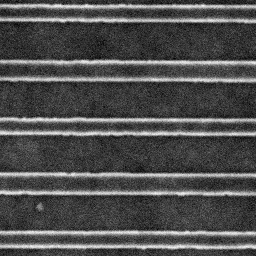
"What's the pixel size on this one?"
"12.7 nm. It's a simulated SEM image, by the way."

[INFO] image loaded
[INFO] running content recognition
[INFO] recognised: lines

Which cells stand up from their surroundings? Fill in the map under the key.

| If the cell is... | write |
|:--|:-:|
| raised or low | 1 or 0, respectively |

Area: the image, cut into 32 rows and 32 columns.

00000000000000000000000000000000
11111111111111111111111111111111
11111111111111111111111111111111
00000000000000000000000000000000
00000000000000000000000000000000
00000000000000000000000000000000
00000000000000000000000000000000
00000000000000000000000000000000
11111111111111111111111111111111
11111111111111111111111111111111
00000000000000000000000000000000
00000000000000000000000000000000
00000000000000000000000000000000
00000000000000000000000000000000
00000000000000000000000000000000
11111111111111111111111111111111
11111111111111111111111111111111
00000000000000000000000000000000
00000000000000000000000000000000
00000000000000000000000000000000
00000000000000000000000000000000
00000000000000000000000000000000
11111111111111111111111111111111
11111111111111111111111111111111
00000000000000000000000000000000
00000000000000000000000000000000
00000000000000000000000000000000
00000000000000000000000000000000
00000000000000000000000000000000
11111111111111111111111111111111
11111111111111111111111111111111
00000000000000000000000000000000